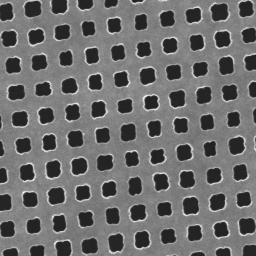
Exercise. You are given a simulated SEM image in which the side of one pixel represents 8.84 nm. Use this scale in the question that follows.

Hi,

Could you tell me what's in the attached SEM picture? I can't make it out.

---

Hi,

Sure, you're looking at a regular array of holes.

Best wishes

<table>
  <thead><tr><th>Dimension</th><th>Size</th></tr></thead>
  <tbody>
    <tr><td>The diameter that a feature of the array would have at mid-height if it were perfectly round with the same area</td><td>15.3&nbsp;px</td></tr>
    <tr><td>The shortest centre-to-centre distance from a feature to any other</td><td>232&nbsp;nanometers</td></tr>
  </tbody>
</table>